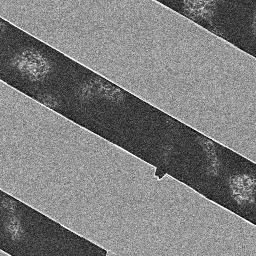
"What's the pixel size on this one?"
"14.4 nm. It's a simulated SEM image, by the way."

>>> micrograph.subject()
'one or a few lines or trenches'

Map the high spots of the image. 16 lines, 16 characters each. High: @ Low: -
@@@@@@@@@@@-----
-@@@@@@@@@@@----
--@@@@@@@@@@@@--
----@@@@@@@@@@@@
------@@@@@@@@@@
@-------@@@@@@@@
@@@------@@@@@@@
@@@@-------@@@@@
@@@@@@-------@@@
@@@@@@@@-------@
@@@@@@@@@-------
@@@@@@@@@@@-----
-@@@@@@@@@@@@---
---@@@@@@@@@@@@-
-----@@@@@@@@@@@
------@@@@@@@@@@